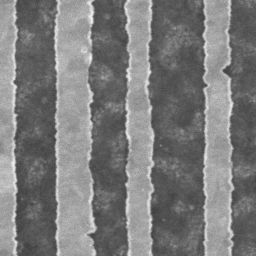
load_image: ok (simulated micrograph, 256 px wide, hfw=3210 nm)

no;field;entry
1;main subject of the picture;one or a few lines or trenches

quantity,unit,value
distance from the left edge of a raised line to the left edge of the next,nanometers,901